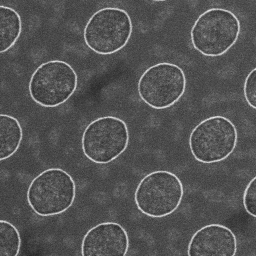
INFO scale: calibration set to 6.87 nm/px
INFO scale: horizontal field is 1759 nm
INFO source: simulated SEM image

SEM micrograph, a regular array of raised bodies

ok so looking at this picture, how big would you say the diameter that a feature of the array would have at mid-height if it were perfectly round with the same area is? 311 nm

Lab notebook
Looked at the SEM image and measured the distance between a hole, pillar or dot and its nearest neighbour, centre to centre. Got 517 nm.